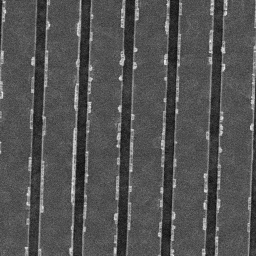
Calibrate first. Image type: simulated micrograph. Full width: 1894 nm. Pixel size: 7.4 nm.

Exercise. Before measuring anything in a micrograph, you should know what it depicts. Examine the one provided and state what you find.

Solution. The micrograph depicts parallel lines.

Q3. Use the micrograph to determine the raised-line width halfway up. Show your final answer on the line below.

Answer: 253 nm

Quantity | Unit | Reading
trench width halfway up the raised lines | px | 9.5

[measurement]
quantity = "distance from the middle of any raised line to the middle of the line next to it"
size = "44.1 px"